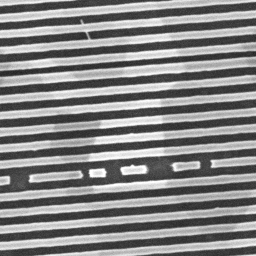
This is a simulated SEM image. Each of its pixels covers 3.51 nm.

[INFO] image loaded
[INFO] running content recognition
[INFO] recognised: parallel lines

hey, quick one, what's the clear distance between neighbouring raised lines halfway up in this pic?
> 32.3 nanometers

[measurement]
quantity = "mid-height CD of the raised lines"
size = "23.6 nanometers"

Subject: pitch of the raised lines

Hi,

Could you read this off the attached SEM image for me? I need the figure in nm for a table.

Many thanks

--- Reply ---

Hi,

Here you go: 56.9